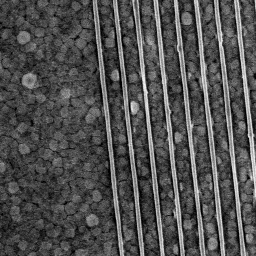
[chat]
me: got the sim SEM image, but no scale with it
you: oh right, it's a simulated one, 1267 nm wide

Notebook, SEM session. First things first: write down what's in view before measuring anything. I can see parallel lines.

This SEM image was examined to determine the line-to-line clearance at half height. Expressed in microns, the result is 0.0824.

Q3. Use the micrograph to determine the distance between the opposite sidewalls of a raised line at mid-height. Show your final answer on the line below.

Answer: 17.2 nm